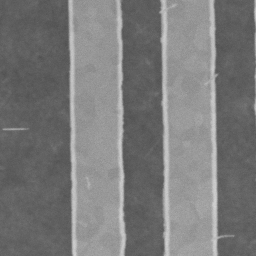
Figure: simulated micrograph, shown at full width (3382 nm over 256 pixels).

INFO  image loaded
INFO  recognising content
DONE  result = one or a few lines or trenches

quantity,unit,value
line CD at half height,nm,629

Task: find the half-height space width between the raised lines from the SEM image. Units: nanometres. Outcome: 594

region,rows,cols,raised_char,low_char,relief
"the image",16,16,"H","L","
LLLLHHHLLLHHHLLL
LLLLHHHLLLHHHLLL
LLLLHHHHLLHHHLLL
LLLLLHHHLLHHHLLL
LLLLLHHHLLHHHLLL
LLLLHHHHLLHHHLLL
LLLLHHHHLLHHHLLL
LLLLLHHHLLHHHLLL
LLLLLHHHLLHHHLLL
LLLLLHHHLLHHHLLL
LLLLLHHHLLHHHLLL
LLLLLHHHLLHHHLLL
LLLLLHHHLLHHHLLL
LLLLLHHHLLHHHLLL
LLLLLHHHLLHHHLLL
LLLLLHHHLLHHHLLL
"